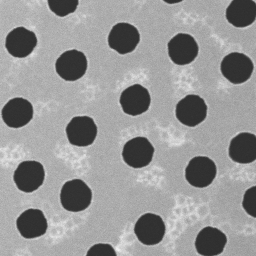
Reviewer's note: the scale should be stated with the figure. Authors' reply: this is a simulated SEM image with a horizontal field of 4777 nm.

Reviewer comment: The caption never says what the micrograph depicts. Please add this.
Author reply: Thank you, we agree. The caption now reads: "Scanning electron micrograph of a regular array of holes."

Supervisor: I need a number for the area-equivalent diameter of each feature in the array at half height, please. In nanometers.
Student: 593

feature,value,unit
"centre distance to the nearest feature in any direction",1070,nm